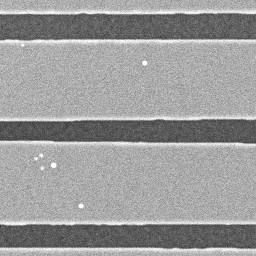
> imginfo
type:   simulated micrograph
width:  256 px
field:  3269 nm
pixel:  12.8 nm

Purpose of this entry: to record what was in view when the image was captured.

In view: lines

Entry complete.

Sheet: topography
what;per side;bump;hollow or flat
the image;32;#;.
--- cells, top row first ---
################################
################################
................................
................................
................................
################################
################################
################################
################################
################################
################################
################################
################################
################################
################################
................................
................................
................................
################################
################################
################################
################################
################################
################################
################################
################################
################################
################################
................................
................................
................................
################################